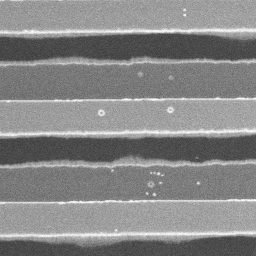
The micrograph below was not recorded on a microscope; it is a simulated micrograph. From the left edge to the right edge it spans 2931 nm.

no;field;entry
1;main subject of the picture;lines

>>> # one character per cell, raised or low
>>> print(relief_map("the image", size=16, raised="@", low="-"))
@@@@@@@@@@@@@@@@
@@@@@@@@@@@@@@@@
----------------
----------------
@@@@@@@@@@@@@@@@
@@@@@@@@@@@@@@@@
@@@@@@@@@@@@@@@@
@@@@@@@@@@@@@@@@
----------------
----------------
@@@@@@@@@@@@@@@@
@@@@@@@@@@@@@@@@
@@@@@@@@@@@@@@@@
@@@@@@@@@@@@@@@@
@@@@@@@@@@@@@@@@
----------------